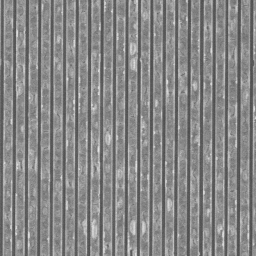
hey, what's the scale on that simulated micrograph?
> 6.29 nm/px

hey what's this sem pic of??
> parallel lines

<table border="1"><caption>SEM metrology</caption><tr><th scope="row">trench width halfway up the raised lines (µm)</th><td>0.0212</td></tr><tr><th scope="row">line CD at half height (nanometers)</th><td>58.2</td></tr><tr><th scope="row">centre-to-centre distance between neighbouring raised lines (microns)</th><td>0.0784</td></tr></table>